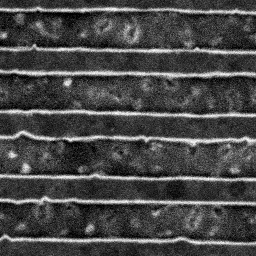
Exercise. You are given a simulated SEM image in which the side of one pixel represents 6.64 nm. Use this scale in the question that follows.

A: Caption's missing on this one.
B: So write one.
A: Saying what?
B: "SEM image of one or a few lines or trenches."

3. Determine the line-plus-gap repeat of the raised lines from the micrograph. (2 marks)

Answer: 425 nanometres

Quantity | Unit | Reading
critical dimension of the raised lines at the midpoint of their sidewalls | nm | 160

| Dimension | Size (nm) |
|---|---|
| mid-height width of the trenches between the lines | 259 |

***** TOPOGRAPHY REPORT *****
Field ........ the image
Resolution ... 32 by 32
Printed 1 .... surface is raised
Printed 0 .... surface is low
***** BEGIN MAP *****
11111111111111111111111111111111
00000000000000000000000000001111
00000000000000000000000000000000
00000000000000000000000000000000
00000000000000000000000000000000
00000000000000000000000000000000
11111111111111111111111111110000
11111111111111111111111111111111
11111111111111111111111111111111
00000000000000000000000000000000
00000000000000000000000000000000
00000000000000000000000000000000
00000000000000000000000000000000
00000000000000000000000000000000
11111111111111111111111100111110
11111111111111111111111111111111
11111111111111111111111111111111
00000000000000000000000111110001
00000000000000000000000000000000
00000000000000000000000000000000
00000000000000000000000000000000
00000000000000000000000000000000
11111111111111111111111111111111
11111111111111111111111111111111
11111111111111111111111111111111
00000000000000000000000000000000
00000000000000000000000000000000
00000000000000000000000000000000
00000000000000000000000000000000
00000000000000000000000000000000
11111111111111111111111111111101
11111111111111111111111111111111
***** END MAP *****